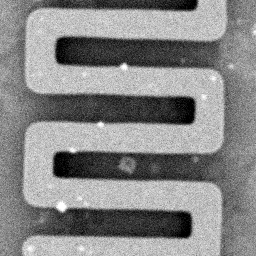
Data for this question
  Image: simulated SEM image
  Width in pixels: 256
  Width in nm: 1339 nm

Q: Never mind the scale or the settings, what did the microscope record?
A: groups of lines, slits or small figures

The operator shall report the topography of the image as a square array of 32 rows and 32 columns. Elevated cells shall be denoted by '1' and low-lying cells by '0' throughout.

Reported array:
00000000000000000000000001110000
00001111111111111111111111110000
00001111111111111111111111110000
00011111111111111111111111110000
00011111000111111111111111110000
00011110000000000000000000000000
00011110000000000000000000000000
00011110000000000000000000000000
00011111111111111111000000000000
00011111111111111111111111100000
00011111111111111111111111110000
00001111111111111111111111110000
00000000000000000000000011110000
00000000000000000000000001110000
00000000000000000000000011110000
00001111111010000000000011110000
00011111111111111111111111110000
00011111111111111111111111110000
00011111111111111111111111100000
00011110000000000000000000000000
00011110000000000000000000000000
00011110000000000000000000000000
00011111111100000000000000000000
00011111111111111111111111100000
00011111111111111111111111110000
00001111111111111111111111110000
00000000000000000000000111110000
00000000000000000000000011100000
00000000000000000000000011100000
00000000000000000000000011100000
00011111111111111111111111100000
00011111111111111111111111100000